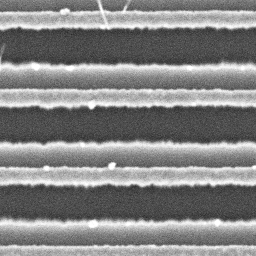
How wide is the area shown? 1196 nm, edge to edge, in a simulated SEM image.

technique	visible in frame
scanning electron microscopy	lines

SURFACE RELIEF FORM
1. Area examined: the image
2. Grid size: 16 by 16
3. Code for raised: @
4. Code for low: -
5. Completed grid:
@@@@@@@@@@@@@@@@
@@@@@@@@@@@@@@@@
----------------
----------------
@@@@@@@@@@@@@@@@
@@@@@@@@@@@@@@@@
@@@@@@@@@@@@@@@@
----------------
----------------
@@@@@@@@@@@@@@@@
@@@@@@@@@@@@@@@@
-----@-@@@@----@
----------------
----------------
@@@@@@@@@@@@@@@@
@@@@@@@@@@@@@@@@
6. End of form